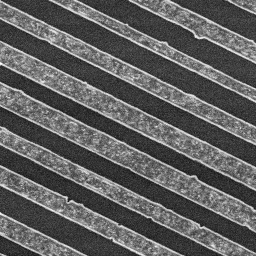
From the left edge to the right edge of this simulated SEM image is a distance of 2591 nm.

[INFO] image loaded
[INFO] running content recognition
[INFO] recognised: parallel lines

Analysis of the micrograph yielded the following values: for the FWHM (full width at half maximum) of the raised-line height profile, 171 nanometers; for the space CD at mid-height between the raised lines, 19.7 px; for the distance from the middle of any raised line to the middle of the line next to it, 0.379 µm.